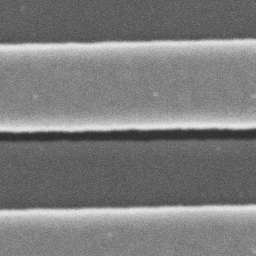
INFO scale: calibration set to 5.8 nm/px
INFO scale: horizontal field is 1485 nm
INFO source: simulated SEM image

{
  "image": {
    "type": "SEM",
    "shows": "lines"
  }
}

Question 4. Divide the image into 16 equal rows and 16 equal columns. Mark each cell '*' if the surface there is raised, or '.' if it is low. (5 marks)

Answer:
................
................
...............*
****************
****************
****************
****************
****************
................
................
................
................
................
****************
****************
****************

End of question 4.